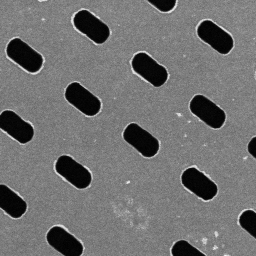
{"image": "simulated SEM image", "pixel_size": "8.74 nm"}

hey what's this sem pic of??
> a regular array of holes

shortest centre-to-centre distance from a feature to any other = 632 nm